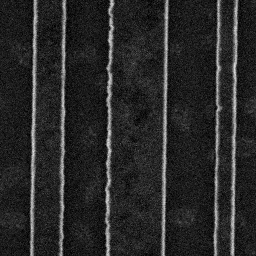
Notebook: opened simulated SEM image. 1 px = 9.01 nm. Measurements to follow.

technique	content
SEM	one or a few lines or trenches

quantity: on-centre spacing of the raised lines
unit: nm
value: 799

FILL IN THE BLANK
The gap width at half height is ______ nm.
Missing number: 447